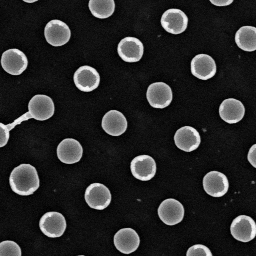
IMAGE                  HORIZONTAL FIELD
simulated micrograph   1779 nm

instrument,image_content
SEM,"a regular array of raised bodies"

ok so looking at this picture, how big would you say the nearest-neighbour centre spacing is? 0.363 um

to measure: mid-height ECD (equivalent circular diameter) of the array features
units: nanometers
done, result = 179